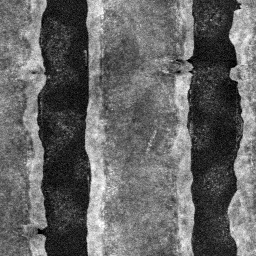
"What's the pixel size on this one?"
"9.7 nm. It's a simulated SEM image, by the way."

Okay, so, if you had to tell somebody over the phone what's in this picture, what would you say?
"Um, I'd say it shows one or a few lines or trenches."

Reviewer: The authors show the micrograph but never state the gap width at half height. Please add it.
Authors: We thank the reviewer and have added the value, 555 nm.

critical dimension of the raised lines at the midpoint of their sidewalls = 0.883 microns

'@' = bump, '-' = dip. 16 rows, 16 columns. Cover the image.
@@----@@@@@@----
@@----@@@@@@---@
@@----@@@@@@---@
@@----@@@@@@---@
@@----@@@@@----@
@@----@@@@@----@
@@----@@@@@----@
@@----@@@@@@---@
@@----@@@@@@---@
@@----@@@@@@---@
@@----@@@@@----@
@@----@@@@@----@
@@----@@@@@@---@
@@----@@@@@@---@
@@----@@@@@----@
@@----@@@@@@---@